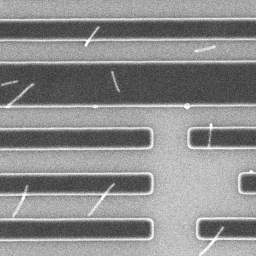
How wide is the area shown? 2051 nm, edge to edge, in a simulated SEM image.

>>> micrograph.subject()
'groups of lines, slits or small figures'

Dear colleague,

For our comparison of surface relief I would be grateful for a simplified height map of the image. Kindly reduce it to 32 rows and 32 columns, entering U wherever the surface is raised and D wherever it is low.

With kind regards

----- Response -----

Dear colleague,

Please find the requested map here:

DDDDDDDDDDDDDDDDDDDDDDDDDDDDDDDD
DDDDDDDDDDDDDDDDDDDDDDDDDDDDDDDD
UUUUUUUUUUUUUUUUUUUUUUUUUUUUUUUU
UUUUUUUUUUUUUUUUUUUUUUUUUUUUUUUU
UUUUUUUUUUUUUUUUUUUUUUUUUUUUUUUU
DDDDDDDDDDDDDDDDDDDDDDDDDDDDDDDD
DDDDDDDDDDDDDDDDDDDDDDDDDDDDDDDD
DDDDDDDDDDDDDDDDDDDDDDDDDDDDDDDD
UUUUUUUUUUUUUUUUUUUUUUUUUUUUUUUU
UUUUUUUUUUUUUUUUUUUUUUUUUUUUUUUU
UUUUUUUUUUUUUUUUUUUUUUUUUUUUUUUU
UUUUUUUUUUUUUUUUUUUUUUUUUUUUUUUU
UUUUUUUUUUUUUUUUUUUUUUUUUUUUUUUU
DDDDDDDDDDDDDDDDDDDDDDDDDDDDDDDD
DDDDDDDDDDDDDDDDDDDDDDDDDDDDDDDD
DDDDDDDDDDDDDDDDDDDDDDDDDDDDDDDD
UUUUUUUUUUUUUUUUUUUDDDDDUUUUUUUU
UUUUUUUUUUUUUUUUUUUDDDDDUUUUUUUU
UUUUUUUUUUUUUUUUUUUDDDDDUUUUUUUU
DDDDDDDDDDDDDDDDDDDDDDDDDDDDDDDD
DDDDDDDDDDDDDDDDDDDDDDDDDDDDDDDD
DDDDDDDDDDDDDDDDDDDDDDDDDDDDDDDD
UUUUUUUUUUUUUUUUUUUDDDDDDDDDDDUU
UUUUUUUUUUUUUUUUUUUDDDDDDDDDDDUU
DDDDDDDDDDDDDDDDDDDDDDDDDDDDDDDD
DDDDDDDDDDDDDDDDDDDDDDDDDDDDDDDD
DDDDDDDDDDDDDDDDDDDDDDDDDDDDDDDD
UUUUUUUUUUUUUUUUUUUDDDDDDUUUUUUU
UUUUUUUUUUUUUUUUUUUDDDDDDUUUUUUU
UUUUUUUUUUUUUUUUUUUDDDDDDUUUUUUU
DDDDDDDDDDDDDDDDDDDDDDDDDDDDDDDD
DDDDDDDDDDDDDDDDDDDDDDDDDDDDDDDD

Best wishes